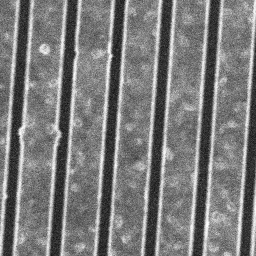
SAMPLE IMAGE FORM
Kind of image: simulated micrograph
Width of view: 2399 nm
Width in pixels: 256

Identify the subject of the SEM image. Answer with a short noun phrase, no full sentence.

parallel lines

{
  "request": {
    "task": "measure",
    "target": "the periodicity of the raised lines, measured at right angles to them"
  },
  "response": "444 nanometers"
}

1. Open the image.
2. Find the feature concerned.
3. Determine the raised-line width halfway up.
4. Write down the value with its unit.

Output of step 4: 0.329 um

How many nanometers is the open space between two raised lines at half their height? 117